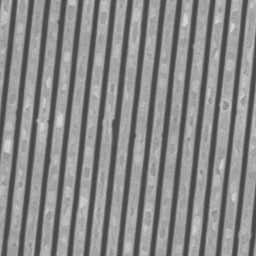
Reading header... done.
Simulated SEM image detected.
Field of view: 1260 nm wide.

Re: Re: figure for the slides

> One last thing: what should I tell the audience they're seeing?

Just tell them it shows parallel lines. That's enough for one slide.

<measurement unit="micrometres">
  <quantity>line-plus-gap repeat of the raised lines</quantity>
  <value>0.0805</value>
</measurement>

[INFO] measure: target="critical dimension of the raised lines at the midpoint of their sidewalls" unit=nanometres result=55.6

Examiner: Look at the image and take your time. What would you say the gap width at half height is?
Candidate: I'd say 27.5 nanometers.